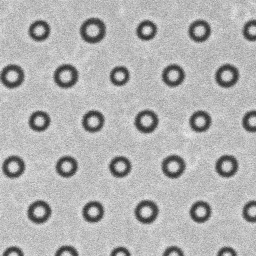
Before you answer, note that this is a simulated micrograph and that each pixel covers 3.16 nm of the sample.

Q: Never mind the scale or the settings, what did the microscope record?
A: a regular array of ring-shaped grooves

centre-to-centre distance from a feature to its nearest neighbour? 0.164 um